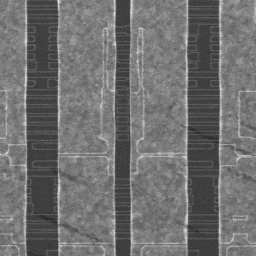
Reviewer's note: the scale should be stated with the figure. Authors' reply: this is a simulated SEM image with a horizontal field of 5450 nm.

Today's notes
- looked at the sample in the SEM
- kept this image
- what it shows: wiring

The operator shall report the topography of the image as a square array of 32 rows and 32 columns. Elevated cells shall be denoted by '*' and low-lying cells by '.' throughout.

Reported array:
***....*******..*******.....****
***....*******..*******.....****
***....*******..*******.....****
***....*******..*******.....****
***....*******..*******.....****
***....*******..*******.....****
***....*******..*******.....****
***....*******..*******.....****
***....*******..*******.....****
***....*******..*******.....****
***....*******..*******.....****
***....*******..*******.....****
***....*******..*******.....****
***....*******..*******.....****
***....*******..*******.....****
***....*******..*******.....****
***....*******..*******.....****
***....*******..*******.....****
***....*******..*******.....****
***....*******..*******.....****
***....*******..*******.....****
***....*******..*******.....****
***....*******..*******....*****
***....*******..*******....*****
***....*******..*******....*****
***....*******..*******....*****
***....*******..*******....*****
***....*******..*******....*****
***....*******..*******....*****
***....*******..*******....*****
***....*******...******.....****
***....*******..*******.....****